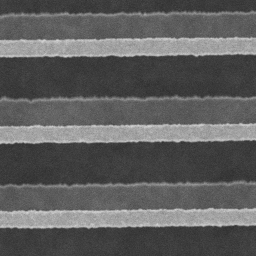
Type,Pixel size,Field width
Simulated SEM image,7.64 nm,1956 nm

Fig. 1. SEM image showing lines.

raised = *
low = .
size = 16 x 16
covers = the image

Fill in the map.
................
****************
****************
********........
................
................
****************
****************
****************
................
................
.........*.*****
****************
****************
................
................